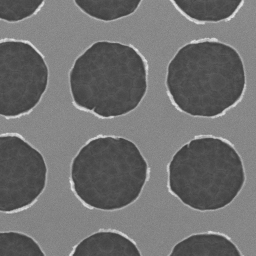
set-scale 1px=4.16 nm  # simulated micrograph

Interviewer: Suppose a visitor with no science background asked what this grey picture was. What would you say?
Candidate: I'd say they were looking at holes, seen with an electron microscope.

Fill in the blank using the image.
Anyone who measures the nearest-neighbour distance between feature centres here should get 394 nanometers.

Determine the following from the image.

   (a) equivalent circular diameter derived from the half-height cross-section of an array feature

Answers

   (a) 310 nm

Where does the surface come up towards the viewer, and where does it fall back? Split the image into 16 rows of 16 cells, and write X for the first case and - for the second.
--XXX---XXX----X
XXXXXXXXXXXXXXXX
XXXXXXXXXXXXXXXX
---XX----XX----X
---X-----X-----X
---X-----XX----X
--XXX----XX----X
XXXXXXXXXXXXXXXX
XXXXXXXXXXXXXXXX
--XXX----XX----X
---XX----XX----X
---XX----XX----X
--XXX---XXX---XX
XXXXXXXXXXXXXXXX
XXXXXXXXXXXXXXXX
--XXX----XX----X